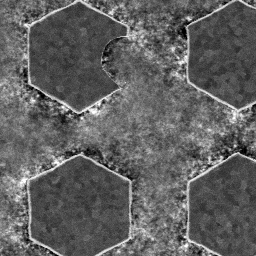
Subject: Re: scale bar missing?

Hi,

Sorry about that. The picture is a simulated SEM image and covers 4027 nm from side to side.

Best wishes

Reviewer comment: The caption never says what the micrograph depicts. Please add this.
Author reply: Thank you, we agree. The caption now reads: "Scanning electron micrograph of raised bodies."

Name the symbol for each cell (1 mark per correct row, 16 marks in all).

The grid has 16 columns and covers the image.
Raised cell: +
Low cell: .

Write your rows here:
....++........++
..++++++....++++
..+++++.....++++
..++++......++++
..+++++.....++++
..+++++.....++++
....++........++
................
................
................
...++++......+++
..++++++....++++
..++++++....++++
..++++++....++++
..++++++....++++
...++++......+++